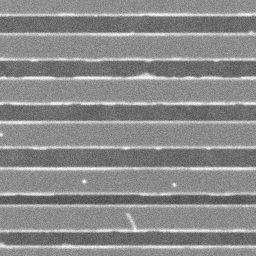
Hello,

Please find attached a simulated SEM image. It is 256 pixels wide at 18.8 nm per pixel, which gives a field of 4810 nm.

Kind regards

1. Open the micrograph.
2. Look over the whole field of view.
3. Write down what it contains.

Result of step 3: lines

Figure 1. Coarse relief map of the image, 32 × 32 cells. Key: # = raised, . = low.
################################
################################
................................
................................
################################
################################
################################
...##.....###.....#.......##....
................................
................................
################################
################################
################################
................................
................................
################################
################################
################################
....##.........##..##.....#.....
................................
................................
################################
################################
################################
................................
................................
################################
################################
################################
................................
................................
################################